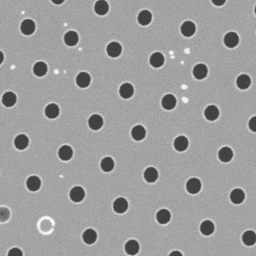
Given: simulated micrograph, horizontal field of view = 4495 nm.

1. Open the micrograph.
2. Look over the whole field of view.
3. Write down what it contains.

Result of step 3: a regular array of holes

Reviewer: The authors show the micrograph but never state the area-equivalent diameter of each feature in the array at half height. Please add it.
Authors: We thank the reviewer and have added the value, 277 nm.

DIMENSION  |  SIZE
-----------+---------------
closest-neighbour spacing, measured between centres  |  759 nanometers